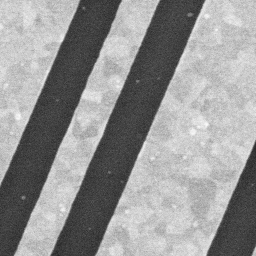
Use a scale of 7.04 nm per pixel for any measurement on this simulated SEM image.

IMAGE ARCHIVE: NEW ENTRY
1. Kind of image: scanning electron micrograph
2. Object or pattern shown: lines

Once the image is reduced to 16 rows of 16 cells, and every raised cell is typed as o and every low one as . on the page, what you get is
ooooo..ooo...ooo
oooo...oo...oooo
oooo...oo...oooo
ooo...oo...ooooo
ooo...oo...ooooo
ooo..ooo...ooooo
oo...oo...oooooo
oo...oo...oooooo
o...oo...ooooooo
o...oo...ooooooo
...oo...ooooooo.
...oo...ooooooo.
..ooo..ooooooo..
..oo...ooooooo..
..oo...oooooo...
.oo...ooooooo...